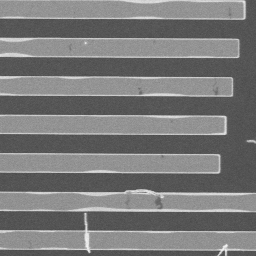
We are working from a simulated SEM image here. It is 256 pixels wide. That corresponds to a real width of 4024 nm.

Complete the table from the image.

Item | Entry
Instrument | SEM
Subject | groups of lines, slits or small figures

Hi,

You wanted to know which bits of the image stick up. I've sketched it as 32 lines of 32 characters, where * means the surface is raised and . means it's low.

*******************************.
*******************************.
................................
................................
................................
******************************..
******************************..
................................
................................
................................
*****************************...
*****************************...
................................
................................
*******************....****.....
****************************....
****************************....
................................
................................
***************************.....
***************************.....
.......****...*************.....
................................
................................
********************************
********************************
................................
................................
................................
********************************
********************************
................................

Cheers